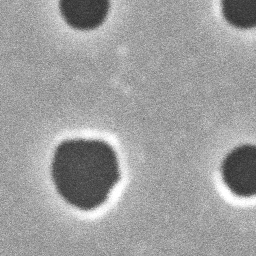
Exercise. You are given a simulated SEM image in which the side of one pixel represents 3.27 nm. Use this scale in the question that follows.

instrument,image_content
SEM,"holes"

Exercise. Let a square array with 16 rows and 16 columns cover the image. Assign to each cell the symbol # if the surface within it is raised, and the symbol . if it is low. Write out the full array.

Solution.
####...#######..
####..########..
################
################
################
################
################
################
################
###....#######..
###....#######..
###....#######..
####...#########
################
################
################